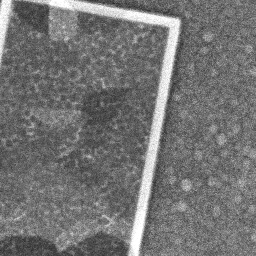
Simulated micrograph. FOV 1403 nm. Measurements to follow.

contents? one or a few lines or trenches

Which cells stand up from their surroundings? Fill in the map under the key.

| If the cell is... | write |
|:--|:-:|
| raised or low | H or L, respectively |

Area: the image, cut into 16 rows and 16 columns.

HHHHHHLLLLLLLLLL
HHHHHHHHHHHLLLLL
HHHHHHHHHHHLLLLL
HHHHHHHHHHHLLLLL
HHHHHHHHHHLLLLLL
HHHHHHHHHHLLLLLL
HHHHHHHHHHLLLLLL
HHHHHHHHHHLLLLLL
HHHHHHHHHHLLLLLL
HHHHHHHHHHLLLLLL
HHHHHHHHHLLLLLLL
HHHHHHHHHLLLLLLL
HHHHHHHHHLLLLLLL
HHHHHHHHHLLLLLLL
HHHHHHHHHLLLLLLL
HHHHHHHHLLLLLLLL